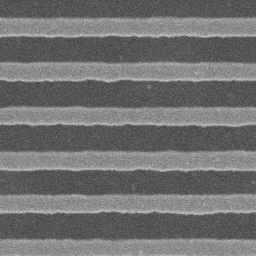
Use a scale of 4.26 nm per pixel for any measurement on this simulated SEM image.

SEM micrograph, lines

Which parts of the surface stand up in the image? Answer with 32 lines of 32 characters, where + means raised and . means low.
................................
................................
++++++++++++++++++++++++++++++++
++++++++++++++++++++++++++++++++
+....+++++..+....+.+.+...++++...
................................
................................
................................
++++++++++++++++++++++++++++++++
++++++++++++++++++++++++++++++++
................................
................................
................................
.+++..+.+++.....................
++++++++++++++++++++++++++++++++
++++++++++++++++++++++++++++++++
................................
................................
................................
++++++++++++++++++++++++++++++++
++++++++++++++++++++++++++++++++
................................
................................
................................
.++++++++++..+++++++++++++++++++
++++++++++++++++++++++++++++++++
++++++++++++...++++.++++++++++++
................................
................................
................................
++++++++++++++++++++++++++++++++
++++++++++++++++++++++++++++++++